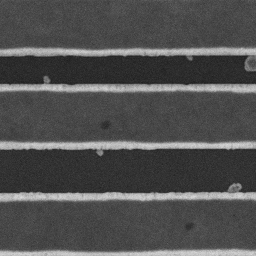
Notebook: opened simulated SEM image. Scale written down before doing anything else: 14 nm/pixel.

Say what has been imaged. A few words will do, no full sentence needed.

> lines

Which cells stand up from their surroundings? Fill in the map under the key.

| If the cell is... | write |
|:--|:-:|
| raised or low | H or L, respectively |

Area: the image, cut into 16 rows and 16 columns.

HHHHHHHHHHHHHHHH
HHHHHHHHHHHHHHHH
HHHHHHHHHHHHHHHH
LLLLLLLLLLLLLLLL
LLLLLLLLLLLLLLLL
HHHHHHHHHHHHHHHH
HHHHHHHHHHHHHHHH
HHHHHHHHHHHHHHHH
HHHHHHHHHHHHHHHH
LLLLLLLLLLLLLLLL
LLLLLLLLLLLLLLLL
LLLLLLLLLLLLLLLL
HHHHHHHHHHHHHHHH
HHHHHHHHHHHHHHHH
HHHHHHHHHHHHHHHH
HHHHHHHHHHHHHHHH